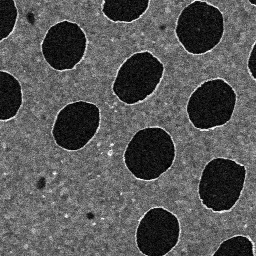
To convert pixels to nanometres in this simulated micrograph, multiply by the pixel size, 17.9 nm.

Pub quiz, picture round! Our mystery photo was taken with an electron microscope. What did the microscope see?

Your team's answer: holes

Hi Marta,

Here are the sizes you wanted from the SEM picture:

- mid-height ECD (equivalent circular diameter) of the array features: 872 nanometers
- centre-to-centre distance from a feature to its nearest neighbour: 1400 nanometers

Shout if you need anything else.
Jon